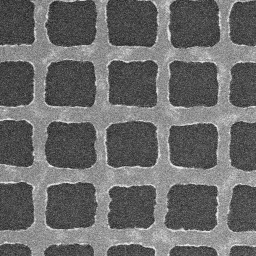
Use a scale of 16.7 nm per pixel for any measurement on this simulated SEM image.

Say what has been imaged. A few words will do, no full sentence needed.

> a regular array of holes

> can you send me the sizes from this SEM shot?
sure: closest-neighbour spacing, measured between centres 1010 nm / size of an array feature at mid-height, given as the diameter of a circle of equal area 887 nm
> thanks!